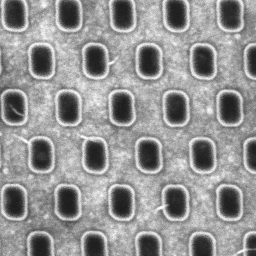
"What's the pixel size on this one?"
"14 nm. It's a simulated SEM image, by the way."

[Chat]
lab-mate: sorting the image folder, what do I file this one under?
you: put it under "a regular array of raised bodies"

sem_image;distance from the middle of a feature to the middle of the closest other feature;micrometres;0.754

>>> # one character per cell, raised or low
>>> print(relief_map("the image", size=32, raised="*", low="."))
***....***....***...***....***..
***....***....***...****...***..
***....***....***....***...***..
.**.....**....***....**.....**..
................................
....**.....*......*......*.....*
....***...***....***....***....*
....***...****...***....***....*
....***...****...***....***....*
....**.....**.....**....***....*
................................
.**....**.....**.....**.....*...
***....***....***....***...***..
***....***....***....***...***..
***....***....***....***...***..
.**.....**....**.....**.....**..
................................
....**.....**....***....**.....*
....***...***....***....***....*
....***...***....***....***....*
....***...***....***....***....*
.....*.....**.....*......*.....*
................................
.**....***....**.....**....***..
***....***....***...****...***..
***....***....***...****...***..
***....***....***....**....***..
...............*......*.....*...
................................
....**....***....***....**.....*
....***...***....***....***...**
....***...***....***....***...**